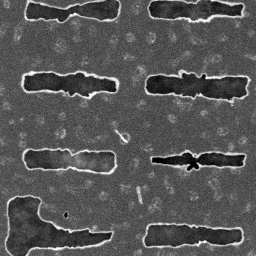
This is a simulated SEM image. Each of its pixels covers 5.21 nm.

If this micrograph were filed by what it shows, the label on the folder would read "holes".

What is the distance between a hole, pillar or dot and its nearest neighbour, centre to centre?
0.398 um